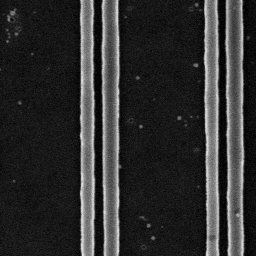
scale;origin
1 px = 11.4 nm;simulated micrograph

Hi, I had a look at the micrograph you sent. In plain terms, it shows lines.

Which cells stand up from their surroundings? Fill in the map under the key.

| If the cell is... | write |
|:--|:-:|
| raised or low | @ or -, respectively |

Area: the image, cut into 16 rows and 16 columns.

-----@@------@@-
-----@@------@@-
-----@@------@@-
-----@@------@@-
-----@@------@@-
-----@@------@@-
-----@@------@@-
-----@@------@@-
-----@@------@@-
-----@@------@@-
-----@@------@@-
-----@@------@@-
-----@@------@@-
-----@@------@@-
-----@@------@@-
-----@@------@@-